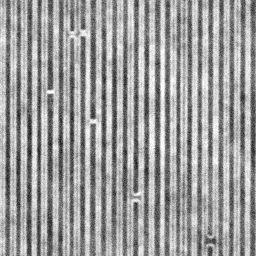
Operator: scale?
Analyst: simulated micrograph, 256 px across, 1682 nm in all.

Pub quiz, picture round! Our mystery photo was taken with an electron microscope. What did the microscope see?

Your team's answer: parallel lines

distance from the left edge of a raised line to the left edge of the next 10.7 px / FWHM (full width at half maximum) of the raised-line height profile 30.4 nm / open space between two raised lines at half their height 5.88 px